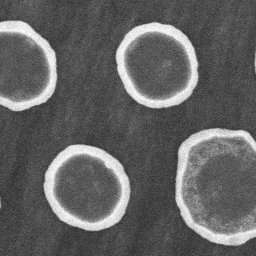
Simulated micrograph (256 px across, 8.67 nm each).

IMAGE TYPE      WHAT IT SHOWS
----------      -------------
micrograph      raised bodies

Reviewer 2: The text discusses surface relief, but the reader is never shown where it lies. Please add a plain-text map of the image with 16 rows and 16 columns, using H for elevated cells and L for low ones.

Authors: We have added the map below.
LLLLLLLLLLLLLLLL
LLLLLLLLLLLLLLLL
HHLLLLLLHHHHLLLL
HHHLLLLHHHHHLLLL
HHHLLLLLHHHHLLLL
HHHLLLLLHHHHLLLL
LHLLLLLLLLLLLLLL
LLLLLLLLLLLLLLLL
LLLLLLLLLLLLLHHL
LLLLHHLLLLLHHHHH
LLLHHHHLLLLHHHHH
LLLHHHHHLLLHHHHH
LLLHHHHHLLLHHHHH
LLLLHHHLLLLLHHHH
LLLLLLLLLLLLLHHH
LLLLLLLLLLLLLLLL